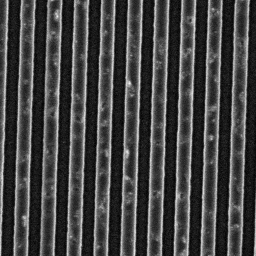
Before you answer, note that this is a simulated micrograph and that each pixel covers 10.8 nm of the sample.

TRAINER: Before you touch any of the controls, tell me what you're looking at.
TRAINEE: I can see parallel lines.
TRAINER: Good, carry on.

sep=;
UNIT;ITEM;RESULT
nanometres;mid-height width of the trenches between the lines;141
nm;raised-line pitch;288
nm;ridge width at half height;151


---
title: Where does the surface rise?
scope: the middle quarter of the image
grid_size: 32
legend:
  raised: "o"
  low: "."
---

..oooo...ooo....ooo...oooo...ooo
..ooo....ooo....ooo...oooo...ooo
..ooo....ooo....ooo...oooo...ooo
..ooo....ooo....ooo...oooo...ooo
..ooo....ooo....ooo...ooo....ooo
..ooo....ooo....ooo...ooo....ooo
..ooo....ooo....ooo...ooo....ooo
..ooo....ooo....ooo...ooo....ooo
..ooo....ooo....ooo...ooo....ooo
..ooo....ooo...oooo...ooo....ooo
..ooo....ooo...oooo...ooo....ooo
..ooo....ooo...oooo...ooo....ooo
..ooo....ooo...ooo....ooo....ooo
..ooo....ooo...oooo...ooo....ooo
..ooo....ooo...oooo...ooo....ooo
..ooo....ooo...oooo...ooo....ooo
..ooo...oooo...oooo...ooo....ooo
..ooo...oooo...oooo...ooo....ooo
..ooo...oooo...oooo...ooo....ooo
..ooo...oooo...ooo....ooo....ooo
..ooo...oooo...ooo....ooo....ooo
..ooo...oooo...ooo....ooo...oooo
..ooo...oooo...ooo....ooo...oooo
.oooo...oooo...ooo....ooo...ooo.
..ooo...oooo...ooo....ooo...oooo
.oooo...ooo....ooo....ooo...ooo.
..ooo...ooo....ooo....ooo...ooo.
..ooo...ooo....ooo....ooo...ooo.
..ooo...ooo....ooo...oooo...ooo.
.oooo...ooo....ooo...oooo...ooo.
.oooo...ooo....ooo...oooo...ooo.
.oooo...ooo....ooo...oooo...ooo.